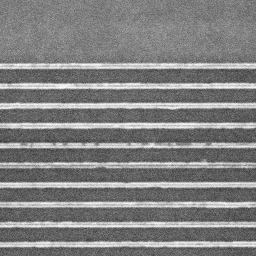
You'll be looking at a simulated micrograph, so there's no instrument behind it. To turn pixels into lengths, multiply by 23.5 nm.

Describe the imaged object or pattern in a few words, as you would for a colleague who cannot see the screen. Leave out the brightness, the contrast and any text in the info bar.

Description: parallel lines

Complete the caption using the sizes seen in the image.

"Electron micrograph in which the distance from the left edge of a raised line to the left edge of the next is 0.465 um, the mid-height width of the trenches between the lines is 385 nanometres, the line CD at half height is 0.0647 um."